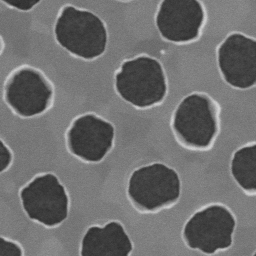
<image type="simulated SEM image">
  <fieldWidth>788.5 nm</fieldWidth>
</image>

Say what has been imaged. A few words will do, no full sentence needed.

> a regular array of holes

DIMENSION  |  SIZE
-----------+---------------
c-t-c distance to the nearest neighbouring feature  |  225 nm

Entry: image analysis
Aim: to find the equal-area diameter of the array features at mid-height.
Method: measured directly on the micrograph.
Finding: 0.147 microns